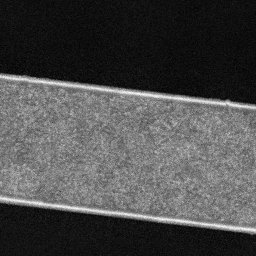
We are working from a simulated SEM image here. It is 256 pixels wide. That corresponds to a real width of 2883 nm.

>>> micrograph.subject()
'one or a few lines or trenches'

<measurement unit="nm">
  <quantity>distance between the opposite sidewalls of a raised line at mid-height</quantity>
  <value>1370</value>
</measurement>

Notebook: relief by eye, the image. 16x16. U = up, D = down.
DDDDDDDDDDDDDDDD
DDDDDDDDDDDDDDDD
DDDDDDDDDDDDDDDD
DDDDDDDDDDDDDDDD
DDDDDDDDDDDDDDDD
UUUUUUDDDDDDDDDD
UUUUUUUUUUUUUUDD
UUUUUUUUUUUUUUUU
UUUUUUUUUUUUUUUU
UUUUUUUUUUUUUUUU
UUUUUUUUUUUUUUUU
UUUUUUUUUUUUUUUU
DUUUUUUUUUUUUUUU
DDDDDDDDDUUUUUUU
DDDDDDDDDDDDDDDD
DDDDDDDDDDDDDDDD